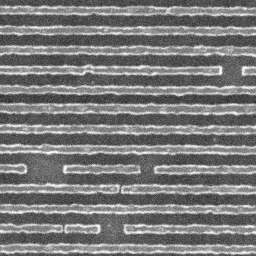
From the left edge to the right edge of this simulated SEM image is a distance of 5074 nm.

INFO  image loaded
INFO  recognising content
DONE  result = parallel lines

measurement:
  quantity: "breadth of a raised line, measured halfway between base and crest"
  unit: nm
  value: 146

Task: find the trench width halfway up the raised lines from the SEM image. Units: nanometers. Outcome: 258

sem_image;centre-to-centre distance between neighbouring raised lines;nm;393